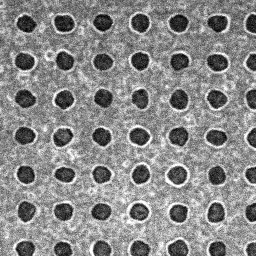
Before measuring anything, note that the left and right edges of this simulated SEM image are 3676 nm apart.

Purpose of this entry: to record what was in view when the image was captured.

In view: a regular array of holes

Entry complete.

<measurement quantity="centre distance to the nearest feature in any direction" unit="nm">532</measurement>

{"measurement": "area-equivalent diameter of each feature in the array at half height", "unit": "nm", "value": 280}